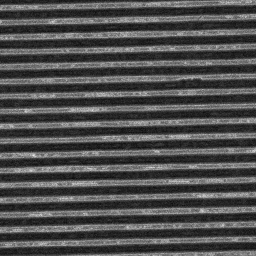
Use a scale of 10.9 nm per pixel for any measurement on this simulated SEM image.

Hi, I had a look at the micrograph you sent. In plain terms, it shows parallel lines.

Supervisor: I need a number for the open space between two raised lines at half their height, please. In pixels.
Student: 8.62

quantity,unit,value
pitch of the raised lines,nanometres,162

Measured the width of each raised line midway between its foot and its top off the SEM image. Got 65.7 nm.